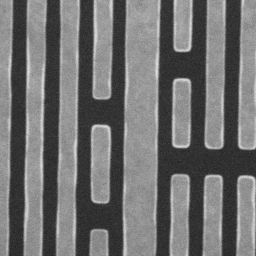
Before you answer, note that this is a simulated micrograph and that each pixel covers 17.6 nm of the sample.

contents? groups of lines, slits or small figures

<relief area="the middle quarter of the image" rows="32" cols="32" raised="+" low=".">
+++.....++++....+++++++.........
+++.....++++....+++++++.........
+++.....++++....+++++++.........
+++.....++++....+++++++.........
+++.....+++.....+++++++.....+++.
+++.....++++....+++++++.....++++
+++....+++++....+++++++.....++++
+++....+++++....+++++++.....++++
+++.....+++.....+++++++.....++++
+++.............+++++++.....++++
+++.............+++++++.....++++
+++............++++++++.....++++
+++............++++++++.....++++
+++............++++++++.....++++
+++............++++++++.....++++
+++.............+++++++.....+++.
+++....++++.....+++++++.....+++.
+++....++++....++++++++.....+++.
+++....++++....++++++++.....+++.
+++....++++....++++++++.....+++.
+++....++++....++++++++.....+++.
+++....++++....++++++++.........
+++....++++....++++++++.........
+++....++++....++++++++.........
+++....++++....++++++++.........
+++....++++....++++++++.........
+++....++++....++++++++.........
+++....++++....++++++++.........
+++....++++....++++++++....++++.
+++....++++....++++++++....++++.
+++....++++....++++++++....++++.
+++....++++....++++++++....++++.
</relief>